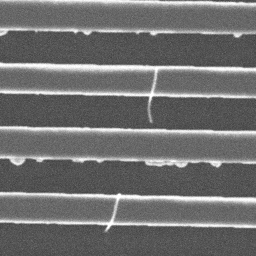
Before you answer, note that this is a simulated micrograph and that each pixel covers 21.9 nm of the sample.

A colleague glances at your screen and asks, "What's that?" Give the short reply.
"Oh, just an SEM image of lines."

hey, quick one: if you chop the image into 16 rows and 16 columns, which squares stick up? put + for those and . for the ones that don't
++++++++++++++++
++++++++++++++++
................
................
++++++++++++++++
++++++++++++++++
................
................
++++++++++++++++
++++++++++++++++
................
................
++++++++++++++++
++++++++++++++++
................
................